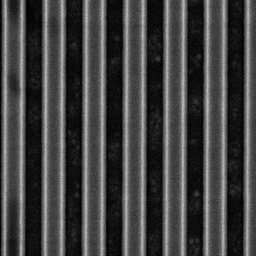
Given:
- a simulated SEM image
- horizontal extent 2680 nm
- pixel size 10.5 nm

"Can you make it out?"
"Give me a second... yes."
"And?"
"parallel lines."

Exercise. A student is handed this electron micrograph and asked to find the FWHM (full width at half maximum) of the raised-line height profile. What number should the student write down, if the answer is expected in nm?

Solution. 217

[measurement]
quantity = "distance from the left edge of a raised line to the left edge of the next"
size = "0.423 micrometres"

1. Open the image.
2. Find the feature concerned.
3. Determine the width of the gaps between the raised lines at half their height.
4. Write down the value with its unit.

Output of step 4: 208 nanometers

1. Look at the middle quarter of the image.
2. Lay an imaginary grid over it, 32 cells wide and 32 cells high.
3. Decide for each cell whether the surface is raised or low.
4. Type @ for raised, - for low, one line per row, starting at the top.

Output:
-----@@@@@-----@@@@@-----@@@@@--
-----@@@@@-----@@@@@-----@@@@@--
-----@@@@@-----@@@@@-----@@@@@--
-----@@@@@-----@@@@@-----@@@@@--
-----@@@@@-----@@@@@-----@@@@@--
-----@@@@@-----@@@@@-----@@@@@--
-----@@@@@-----@@@@@-----@@@@@--
-----@@@@@-----@@@@@-----@@@@@--
-----@@@@@-----@@@@@-----@@@@@--
-----@@@@@-----@@@@@-----@@@@@--
-----@@@@@-----@@@@@-----@@@@@--
-----@@@@@-----@@@@@-----@@@@@--
-----@@@@@-----@@@@@-----@@@@@--
-----@@@@@-----@@@@@-----@@@@@--
-----@@@@@-----@@@@@-----@@@@@--
-----@@@@@-----@@@@@-----@@@@@--
-----@@@@@-----@@@@@-----@@@@@--
-----@@@@@-----@@@@@-----@@@@@--
-----@@@@@-----@@@@@-----@@@@@--
-----@@@@@-----@@@@@-----@@@@@--
-----@@@@@-----@@@@@-----@@@@@--
-----@@@@@-----@@@@@-----@@@@@--
-----@@@@@-----@@@@@-----@@@@@--
-----@@@@@-----@@@@@-----@@@@@--
-----@@@@@-----@@@@@-----@@@@@--
-----@@@@@-----@@@@@-----@@@@@--
-----@@@@@-----@@@@@-----@@@@@--
-----@@@@@-----@@@@@-----@@@@@--
-----@@@@@-----@@@@@-----@@@@@--
-----@@@@@-----@@@@@-----@@@@@--
-----@@@@@-----@@@@@-----@@@@@--
-----@@@@@-----@@@@@-----@@@@@--